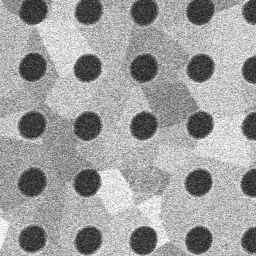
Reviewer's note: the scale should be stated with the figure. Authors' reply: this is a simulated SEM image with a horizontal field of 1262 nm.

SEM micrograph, a regular array of holes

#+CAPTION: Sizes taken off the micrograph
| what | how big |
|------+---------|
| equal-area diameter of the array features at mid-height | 29.8 pixels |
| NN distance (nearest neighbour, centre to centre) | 56.1 px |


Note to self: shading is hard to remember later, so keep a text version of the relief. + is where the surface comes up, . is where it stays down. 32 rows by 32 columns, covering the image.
+++...+++....+++....+++....++++.
++....+++....+++....+++....+++..
+++..++++....+++...++++...+++++.
++++++++++++++++++++++++++++++++
++++++++++++++++++++++++++++++++
++++++++++++++++++++++++++++++++
++++++++++++++++++++++++++++++++
+++...++++...++++...++++...++++.
++....+++....+++....+++....+++..
+++..++++...++++...++++...++++..
++++++++++++++++++++++++++++++++
++++++++++++++++++++++++++++++++
++++++++++++++++++++++++++++++++
++++++++++++++++++++++++++++++++
+++..+++++..+++++..+++++..+++++.
++....+++....+++....+++....+++..
++....+++....+++....+++...++++..
++++++++++..+++++.+++++++++++++.
++++++++++++++++++++++++++++++++
++++++++++++++++++++++++++++++++
++++++++++++++++++++++++++++++++
+++...++++..++++++++++++..+++++.
++....+++....++++++++++....+++..
++....+++...+++++++++++...++++..
+++..+++++.+++++++++++++..+++++.
++++++++++++++++++++++++++++++++
++++++++++++++++++++++++++++++++
++++++++++++++++++++++++++++++++
+++..+++++..+++++..+++++..+++++.
++....+++....+++....+++....+++..
++....+++....+++....+++....+++..
+++..+++++..+++++..+++++..+++++.